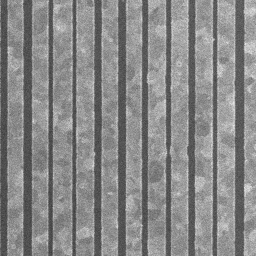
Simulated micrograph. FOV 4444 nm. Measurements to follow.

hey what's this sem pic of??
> parallel lines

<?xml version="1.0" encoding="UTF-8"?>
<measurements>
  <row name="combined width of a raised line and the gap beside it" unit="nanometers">407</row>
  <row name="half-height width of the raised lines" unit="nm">289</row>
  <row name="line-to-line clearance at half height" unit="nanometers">130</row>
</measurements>